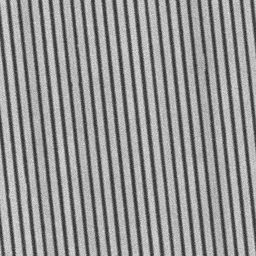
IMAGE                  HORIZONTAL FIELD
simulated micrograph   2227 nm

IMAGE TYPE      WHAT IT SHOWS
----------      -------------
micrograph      parallel lines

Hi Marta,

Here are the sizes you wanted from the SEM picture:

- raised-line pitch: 91.6 nm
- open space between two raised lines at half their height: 34.6 nm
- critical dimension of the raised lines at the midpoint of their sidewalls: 59.4 nanometers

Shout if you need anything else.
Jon